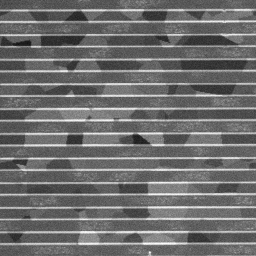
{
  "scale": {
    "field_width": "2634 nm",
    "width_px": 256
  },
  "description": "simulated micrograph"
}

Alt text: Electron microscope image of parallel lines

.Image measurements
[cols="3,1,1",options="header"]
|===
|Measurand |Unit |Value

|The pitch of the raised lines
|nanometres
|254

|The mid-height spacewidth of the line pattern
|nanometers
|138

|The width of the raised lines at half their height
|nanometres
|120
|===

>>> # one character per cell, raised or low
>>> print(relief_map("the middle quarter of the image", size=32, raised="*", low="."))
********************************
********************************
................................
................................
................................
********************************
********************************
********************************
................................
................................
................................
********************************
********************************
********************************
................................
................................
................................
.*******************************
********************************
********************************
................................
................................
................................
................................
********************************
********************************
................................
................................
................................
................................
********************************
********************************